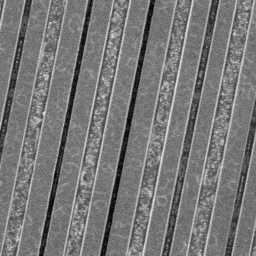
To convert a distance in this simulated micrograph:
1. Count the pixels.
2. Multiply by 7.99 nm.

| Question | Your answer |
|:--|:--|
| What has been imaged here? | parallel lines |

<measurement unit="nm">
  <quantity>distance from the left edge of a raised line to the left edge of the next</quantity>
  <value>244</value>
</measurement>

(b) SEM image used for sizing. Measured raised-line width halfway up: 0.158 µm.